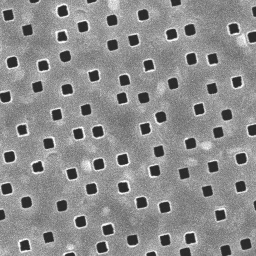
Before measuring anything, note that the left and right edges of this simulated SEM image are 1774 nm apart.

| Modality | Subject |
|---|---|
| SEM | a regular array of holes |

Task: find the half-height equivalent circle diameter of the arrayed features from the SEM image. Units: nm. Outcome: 79.7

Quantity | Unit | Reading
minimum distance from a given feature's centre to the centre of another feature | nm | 169